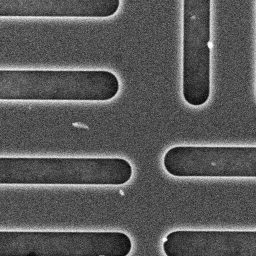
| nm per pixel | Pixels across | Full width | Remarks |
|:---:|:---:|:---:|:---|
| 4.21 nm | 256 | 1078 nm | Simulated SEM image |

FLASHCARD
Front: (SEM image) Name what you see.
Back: groups of lines, slits or small figures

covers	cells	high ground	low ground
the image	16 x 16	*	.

.......****..***
***********..***
***********..***
***********..***
.......****..***
.......****..***
****************
****************
****************
***********.....
........**......
........********
****************
****************
.......****.....
........**......